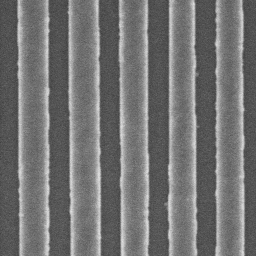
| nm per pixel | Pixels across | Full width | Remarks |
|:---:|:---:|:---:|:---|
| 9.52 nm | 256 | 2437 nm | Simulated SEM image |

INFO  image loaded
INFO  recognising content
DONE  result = lines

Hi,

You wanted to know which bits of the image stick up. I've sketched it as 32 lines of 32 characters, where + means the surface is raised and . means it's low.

..++++...+++...+++...+++...+++..
..++++...+++...+++...+++...+++..
..++++...+++...+++...+++...+++..
..++++...+++...+++...+++...+++..
..++++...+++...+++...+++...+++..
..++++...+++...+++...+++...+++..
..++++...+++...+++...+++...+++..
..++++...+++...+++...+++...+++..
..++++...+++...+++...+++...+++..
..++++...+++...+++...+++...+++..
..++++...+++...+++...+++...+++..
..++++...+++...+++...+++...+++..
..++++...+++...+++...+++...+++..
..++++...+++...+++...+++...+++..
..++++...+++...+++...+++...+++..
..++++...+++...+++...+++...+++..
..++++...+++...+++...+++...+++..
..++++...+++...+++...+++...+++..
..++++...+++...+++...+++...+++..
..++++...+++...++++..+++...+++..
..++++...+++...++++..+++...+++..
..++++...+++...++++..+++...+++..
..++++...+++...++++..+++...+++..
...+++...+++...++++..+++...+++..
...+++...+++...++++..+++...+++..
...+++...+++...+++...+++...+++..
...+++...+++...+++...+++...+++..
...+++...+++...++++..++++..+++..
...+++...+++...++++..++++..+++..
...+++...+++...++++..+++...+++..
...+++...+++...+++...+++...+++..
...+++...+++...+++...++++..+++..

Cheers